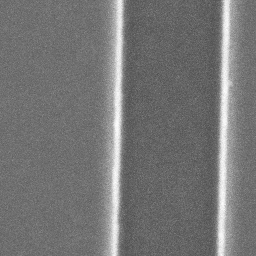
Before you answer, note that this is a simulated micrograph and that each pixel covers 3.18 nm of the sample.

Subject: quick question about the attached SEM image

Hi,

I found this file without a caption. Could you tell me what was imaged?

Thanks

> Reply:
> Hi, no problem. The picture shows one or a few lines or trenches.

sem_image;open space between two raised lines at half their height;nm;329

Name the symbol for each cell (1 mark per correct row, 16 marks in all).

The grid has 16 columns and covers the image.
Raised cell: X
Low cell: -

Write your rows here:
XXXXXXXX------XX
XXXXXXXX------XX
XXXXXXXX------XX
XXXXXXX-------XX
XXXXXXX-------XX
XXXXXXX-------XX
XXXXXXX-------XX
XXXXXXX-------XX
XXXXXXX-------XX
XXXXXXX-------XX
XXXXXXX-------XX
XXXXXXX-------XX
XXXXXXX-------XX
XXXXXXX-------XX
XXXXXXX-------XX
XXXXXXX-------XX